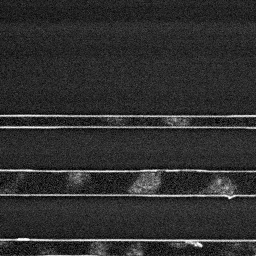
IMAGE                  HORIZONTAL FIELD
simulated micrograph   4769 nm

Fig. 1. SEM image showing one or a few lines or trenches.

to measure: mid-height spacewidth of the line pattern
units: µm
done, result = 0.82